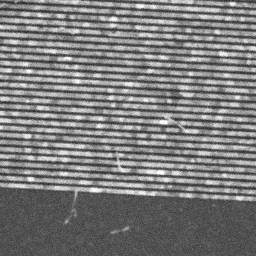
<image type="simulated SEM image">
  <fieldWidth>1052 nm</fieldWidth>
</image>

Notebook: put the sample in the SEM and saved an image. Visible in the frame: parallel lines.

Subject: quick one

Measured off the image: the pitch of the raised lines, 29.5 nanometers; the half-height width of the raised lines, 10.3 nm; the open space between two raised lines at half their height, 16.9 nanometres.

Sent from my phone